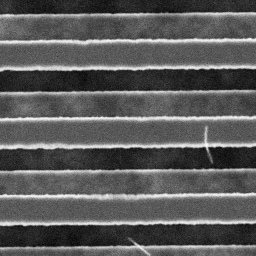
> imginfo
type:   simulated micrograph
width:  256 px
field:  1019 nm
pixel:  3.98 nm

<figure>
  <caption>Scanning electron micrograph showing lines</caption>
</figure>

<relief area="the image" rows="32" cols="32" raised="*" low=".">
................................
................................
********************************
********************************
********************************
********************************
********************************
********************************
******************************.*
................................
................................
............********************
********************************
********************************
********************************
********************************
********************************
********************************
**.*..*.........................
................................
................................
********************************
********************************
********************************
********************************
********************************
********************************
********************************
................................
................................
................................
********************************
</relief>